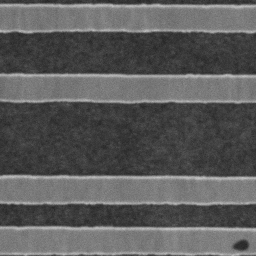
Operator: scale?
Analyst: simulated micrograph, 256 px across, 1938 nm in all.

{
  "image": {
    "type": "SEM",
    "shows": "lines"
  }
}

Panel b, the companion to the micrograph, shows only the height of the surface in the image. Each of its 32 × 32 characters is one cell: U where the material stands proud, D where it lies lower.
DDDDDDDDDDDDDDDDDDDDDDDDDDDDDDDD
UUUUUUUUUUUUUUUUUUUUUUUUUUUUUUUU
UUUUUUUUUUUUUUUUUUUUUUUUUUUUUUUU
UUUUUUUUUUUUUUUUUUUUUUUUUUUUUUUU
DDDDDDDDDDDDDDDDDDDDDDDDDDDDDDDD
DDDDDDDDDDDDDDDDDDDDDDDDDDDDDDDD
DDDDDDDDDDDDDDDDDDDDDDDDDDDDDDDD
DDDDDDDDDDDDDDDDDDDDDDDDDDDDDDDD
DDDDDDDDDDDDDDDDDDDDDDDDDDDDDDDD
UUUUUUUUUUUUUUUUUUUUUUUUUUUUUUUD
UUUUUUUUUUUUUUUUUUUUUUUUUUUUUUUU
UUUUUUUUUUUUUUUUUUUUUUUUUUUUUUUU
UUUUUUUUUUUUUUUUUUUUUUUUUUUUUUUU
DDDDDDDDDDDDDDDDDDDDDDDDDDDDDDDD
DDDDDDDDDDDDDDDDDDDDDDDDDDDDDDDD
DDDDDDDDDDDDDDDDDDDDDDDDDDDDDDDD
DDDDDDDDDDDDDDDDDDDDDDDDDDDDDDDD
DDDDDDDDDDDDDDDDDDDDDDDDDDDDDDDD
DDDDDDDDDDDDDDDDDDDDDDDDDDDDDDDD
DDDDDDDDDDDDDDDDDDDDDDDDDDDDDDDD
DDDDDDDDDDDDDDDDDDDDDDDDDDDDDDDD
DDDDDDDDDDDDDDDDDDDDDDDDDDDDDDDD
UUUUUUUUUUUUUUUUUUUUUUUUUUUUUUUU
UUUUUUUUUUUUUUUUUUUUUUUUUUUUUUUU
UUUUUUUUUUUUUUUUUUUUUUUUUUUUUUUU
DDDDDDDDDDDDDDDDDDDDDUDDUUUDDDDD
DDDDDDDDDDDDDDDDDDDDDDDDDDDDDDDD
DDDDDDDDDDDDDDDDDDDDDDDDDDDDDDDD
UUUUUUUUUUUUUUUUUUUUDDDDUUUDDDDD
UUUUUUUUUUUUUUUUUUUUUUUUUUUUUUUU
UUUUUUUUUUUUUUUUUUUUUUUUUUUUUUUU
UUUUUUUUUUUUUUUUUUUUUUUUUUUUUUUU